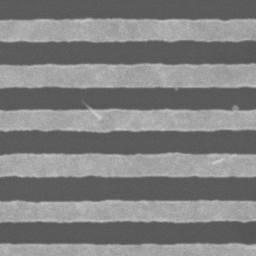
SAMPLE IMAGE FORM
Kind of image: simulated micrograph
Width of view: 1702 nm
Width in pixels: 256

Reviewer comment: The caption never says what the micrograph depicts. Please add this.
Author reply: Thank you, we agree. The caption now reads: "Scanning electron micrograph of lines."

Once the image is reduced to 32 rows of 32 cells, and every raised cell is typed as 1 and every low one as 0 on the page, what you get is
00000000000000000000000000000000
00000000000000000000000000000000
00001111111111111111011111110111
11111111111111111111111111111111
11111111111111111111111111111111
00000000000000000000000000000000
00000000000000000000000000000000
00000000000000000000000000000000
11111111111111111111111111111111
11111111111111111111111111111111
11111111111111111111111111111111
00000000000000000000000000000000
00000000000000000000000000000000
00000000000000000000000000000000
11111111111111111111111111111111
11111111111111111111111111111111
00000000000000000000000000000000
00000000000000000000000000000000
00000000000000000000000000000000
11111111111111100111111111111111
11111111111111111111111111111111
11111111111111111111111111111111
00000000000000000000000000000000
00000000000000000000000000000000
00000000000000000000000000000000
11111111111111111111111111111111
11111111111111111111111111111111
11111111111111111111111111111111
00000000000000000000000000000000
00000000000000000000000000000000
00000000000000000000000011001100
11111111111111111111111111111111